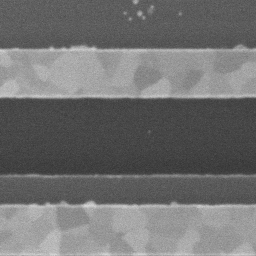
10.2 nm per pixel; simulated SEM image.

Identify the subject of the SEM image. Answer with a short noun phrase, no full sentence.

lines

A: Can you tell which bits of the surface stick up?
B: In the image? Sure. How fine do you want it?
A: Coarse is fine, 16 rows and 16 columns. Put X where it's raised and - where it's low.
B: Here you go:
XXXXXXXXXXXXXXXX
XXXXXXXXXXXXXXXX
XXXXXXXXXXXXXXXX
XXXXXXXXXXXXXXXX
XXXXXXXXXXXXXXXX
XXXXXXXXXXXXXXXX
----------------
----------------
----------------
----------------
----------------
XXXXXXXXXXXXXXXX
XXXXXXXXXXXXXXXX
XXXXXXXXXXXXXXXX
XXXXXXXXXXXXXXXX
XXXXXXXXXXXXXXXX